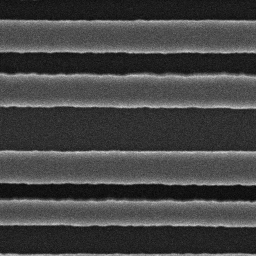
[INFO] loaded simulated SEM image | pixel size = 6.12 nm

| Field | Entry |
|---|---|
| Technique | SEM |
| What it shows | lines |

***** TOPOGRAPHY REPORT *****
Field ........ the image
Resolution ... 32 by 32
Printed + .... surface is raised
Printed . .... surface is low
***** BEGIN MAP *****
................................
................................
................................
++++++++++++++++++++++++++++++++
++++++++++++++++++++++++++++++++
++++++++++++++++++++++++++++++++
..+++.+.++++++++++++++++++++++++
................................
................................
++++++.+++++.+..+++........++...
++++++++++++++++++++++++++++++++
++++++++++++++++++++++++++++++++
++++++++++++++++++++++++++++++++
.............................+++
................................
................................
................................
................................
................................
++++++++++++++++++++++++++++++++
++++++++++++++++++++++++++++++++
++++++++++++++++++++++++++++++++
++++++++++++++++++++++++++++++++
................................
................................
++++++++++++++++++++++++++++++++
++++++++++++++++++++++++++++++++
++++++++++++++++++++++++++++++++
................................
................................
................................
................................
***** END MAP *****